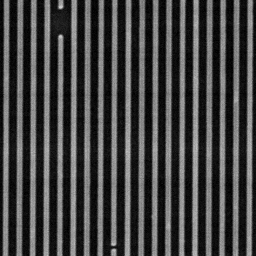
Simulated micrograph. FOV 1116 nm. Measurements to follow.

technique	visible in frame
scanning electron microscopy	parallel lines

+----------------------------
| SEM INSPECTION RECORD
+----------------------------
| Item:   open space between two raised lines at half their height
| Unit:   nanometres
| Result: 38.1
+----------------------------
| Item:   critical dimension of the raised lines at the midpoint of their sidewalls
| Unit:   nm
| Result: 19.1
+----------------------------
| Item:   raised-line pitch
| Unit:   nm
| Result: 59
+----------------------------